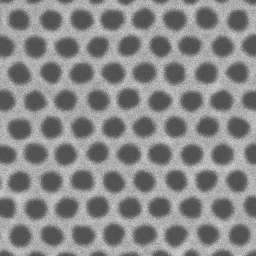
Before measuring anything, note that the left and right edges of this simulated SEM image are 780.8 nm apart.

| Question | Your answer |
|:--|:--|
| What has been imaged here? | a regular array of holes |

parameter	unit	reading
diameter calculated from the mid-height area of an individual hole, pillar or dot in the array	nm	68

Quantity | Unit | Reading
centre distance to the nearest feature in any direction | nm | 92.2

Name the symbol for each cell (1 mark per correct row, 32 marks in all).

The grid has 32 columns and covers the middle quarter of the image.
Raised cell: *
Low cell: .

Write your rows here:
**.....***.....***....***.....**
**.....***.....**......**.....**
*.......*.......*......**......*
**.....***.....**......**.....**
**....*****...*****..*****....**
********************************
.******...****....**************
...***....***......***....***...
...***.....**......**......**...
...***.....**......**......**...
...***.....***....***.....***...
..*****...*****.******...*****..
********************************
***...******..*****..*****...***
**.....***.....***....***.....**
**.....***......*......**......*
**......*.......*......**......*
**.....***.....***....****....**
***...******.******.*******.****
********************************
..*****....***....****....*****.
...***.....***.....**......***..
...***.....**......**......**...
...***.....**......**......**...
..*****...****....****....****..
.*******************************
****..*********************.****
**.....***....****....****....**
**.....***.....**......**......*
*......***.....**......**......*
**.....***.....***....****.....*
****..*****...*****...*****...**